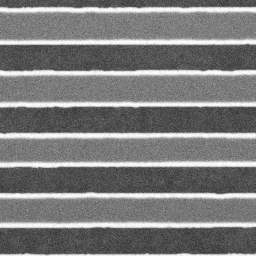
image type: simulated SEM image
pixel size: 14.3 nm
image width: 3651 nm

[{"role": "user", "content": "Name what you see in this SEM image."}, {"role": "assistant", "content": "lines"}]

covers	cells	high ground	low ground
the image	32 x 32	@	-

--------------------------------
@@@@@@@@@@@@@@@@@@@@@@@@@@@@@@@@
@@@@@@@@@@@@@@@@@@@@@@@@@@@@@@@@
@@@@@@@@@@@@@@@@@@@@@@@@@@@@@@@@
@@@@@@@@@@@@@@@@@@@@@@@@@@@@@@@@
--------------------------------
--------------------------------
--------------------------------
--------------------------------
@@@@@@@@@@@@@@@@@@@@@@@@@@@@@@@@
@@@@@@@@@@@@@@@@@@@@@@@@@@@@@@@@
@@@@@@@@@@@@@@@@@@@@@@@@@@@@@@@@
@@@@@@@@@@@@@@@@@@@@@@@@@@@@@@@@
--------------------------------
--------------------------------
--------------------------------
--------------------------------
@@@@@@@@@@@@@@@@@@@@@@@@@@@@@@@@
@@@@@@@@@@@@@@@@@@@@@@@@@@@@@@@@
@@@@@@@@@@@@@@@@@@@@@@@@@@@@@@@@
@@@@@@@@@@@@@@@@@@@@@@@@@@@@@@@@
--------------------------------
--------------------------------
--------------------------------
@@@@@@@@@@@@@@@@@@@@@@@@@@@@@@@@
@@@@@@@@@@@@@@@@@@@@@@@@@@@@@@@@
@@@@@@@@@@@@@@@@@@@@@@@@@@@@@@@@
@@@@@@@@@@@@@@@@@@@@@@@@@@@@@@@@
--------------------------------
--------------------------------
--------------------------------
--------------------------------